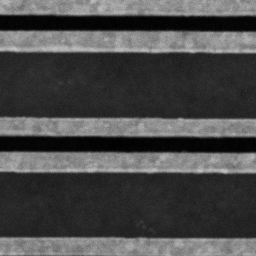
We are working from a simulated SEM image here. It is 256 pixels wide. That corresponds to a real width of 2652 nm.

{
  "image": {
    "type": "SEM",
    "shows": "lines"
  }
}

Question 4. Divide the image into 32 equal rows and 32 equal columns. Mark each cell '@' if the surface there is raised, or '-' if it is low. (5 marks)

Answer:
@@@@@@@@@@@@@@@@@@@@@@@@@@@@@@@@
@@@@@@@@@@@@@@@@@@@@@@@@@@@@@@@@
--------------------------------
--------------------------------
@@@@@@@@@@@@@@@@@@@@@@@@@@@@@@@@
@@@@@@@@@@@@@@@@@@@@@@@@@@@@@@@@
----------------------------@@@@
--------------------------------
--------------------------------
--------------------------------
--------------------------------
--------------------------------
--------------------------------
--------------------------------
--------------------------------
@@@@@@@@@@@@@@@@@@@@@@@@@@@@@@@@
@@@@@@@@@@@@@@@@@@@@@@@@@@@@@@@@
--------------------------------
--------------------------------
@@@@@@@@@@@@@@@@@@@@@@@@@@@@@@@@
@@@@@@@@@@@@@@@@@@@@@@@@@@@@@@@@
------------------------------@-
--------------------------------
--------------------------------
--------------------------------
--------------------------------
--------------------------------
--------------------------------
--------------------------------
--------------------------------
@@@@@@@@@@@@@@@@@@@@@@@@@@@@@@@@
@@@@@@@@@@@@@@@@@@@@@@@@@@@@@@@@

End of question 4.